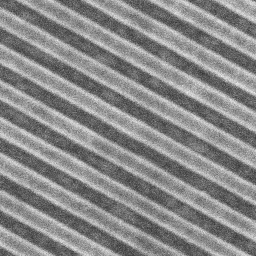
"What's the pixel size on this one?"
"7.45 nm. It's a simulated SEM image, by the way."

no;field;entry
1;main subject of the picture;parallel lines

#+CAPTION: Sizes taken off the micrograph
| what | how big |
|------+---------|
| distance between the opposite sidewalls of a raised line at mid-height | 119 nanometers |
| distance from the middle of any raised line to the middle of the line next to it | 238 nanometers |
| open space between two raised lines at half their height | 120 nanometres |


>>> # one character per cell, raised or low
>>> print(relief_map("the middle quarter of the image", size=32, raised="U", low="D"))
DDUUUUUUUUDDDDDDDDDUUUUUUUUDDDDD
DDDDUUUUUUUUDDDDDDDDUUUUUUUUDDDD
DDDDDDUUUUUUUUDDDDDDDDUUUUUUUUDD
DDDDDDDDUUUUUUUUDDDDDDDDUUUUUUUU
UDDDDDDDDUUUUUUUUDDDDDDDDDUUUUUU
UUUDDDDDDDDUUUUUUUUDDDDDDDDDUUUU
UUUUDDDDDDDDDUUUUUUUUDDDDDDDDUUU
UUUUUUDDDDDDDDDUUUUUUUDDDDDDDDDU
DUUUUUUUDDDDDDDDDUUUUUUUDDDDDDDD
DDUUUUUUUUDDDDDDDDUUUUUUUUDDDDDD
DDDDUUUUUUUUDDDDDDDDUUUUUUUUDDDD
DDDDDDUUUUUUUDDDDDDDDDUUUUUUUUDD
DDDDDDDUUUUUUUUDDDDDDDDDUUUUUUUU
UDDDDDDDDDUUUUUUUDDDDDDDDDUUUUUU
UUDDDDDDDDDUUUUUUUUDDDDDDDDUUUUU
UUUUDDDDDDDDDUUUUUUUUDDDDDDDDUUU
UUUUUUDDDDDDDDDUUUUUUUDDDDDDDDDU
UUUUUUUUDDDDDDDDDUUUUUUUDDDDDDDD
DDUUUUUUUUDDDDDDDDDUUUUUUUDDDDDD
DDDUUUUUUUUDDDDDDDDDUUUUUUUUDDDD
DDDDDUUUUUUUUDDDDDDDDDUUUUUUUUDD
DDDDDDDUUUUUUUUDDDDDDDDUUUUUUUUD
DDDDDDDDDUUUUUUUUDDDDDDDDUUUUUUU
UUDDDDDDDDDUUUUUUUUDDDDDDDDUUUUU
UUUUDDDDDDDDUUUUUUUUDDDDDDDDDUUU
UUUUUUDDDDDDDDUUUUUUUUDDDDDDDDDU
UUUUUUUUDDDDDDDDUUUUUUUUDDDDDDDD
DDUUUUUUUDDDDDDDDDUUUUUUUUDDDDDD
DDDDUUUUUUUDDDDDDDDDUUUUUUUUDDDD
DDDDDUUUUUUUUDDDDDDDDDUUUUUUUDDD
DDDDDDDUUUUUUUUDDDDDDDDDUUUUUUUD
DDDDDDDDDUUUUUUUUDDDDDDDDUUUUUUU